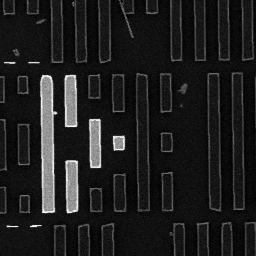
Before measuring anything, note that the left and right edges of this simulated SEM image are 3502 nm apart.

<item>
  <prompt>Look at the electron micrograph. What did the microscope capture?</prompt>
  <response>wiring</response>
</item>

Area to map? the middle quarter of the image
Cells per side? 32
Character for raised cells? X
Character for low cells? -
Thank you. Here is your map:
--------------------------------
--------------------------------
------------------X-----XXX-----
XXX---XXX---XXX---XXX---XXX-----
XXX---XXX---XXX---XXX---XXX-----
XXX---XXX---XXX---XXX---XXX-----
XXX---XXX---XXX---XXX---XXX--X--
XXX---XXX---XXX---XXX---XXX-----
XXX---XXX---XXX---XXX---XXX-----
XXX---------XXX---XXX---XXX-----
XXX---------XXX---XXX---XXX-----
-XX---------XXX---XXX---XXX-----
-XX---------------XXX-----------
-XX---------------XXX-----------
-XX----XX---------XXX-----------
-XX----XX---------XXX-----------
-------XX---------XXX-----------
-------XX---------XXX---XXX-----
-------XX---XXX---XXX---XXX-----
-------XX---XXX---XXX---XXX-----
-------XX----XX---XXX---XXX-----
-------XX---------XXX---XXX-----
-------XX---------XXX-----------
-------XX---------XXX-----------
-XX----XX---------XXX-----------
-XX----XX---------XXX-----------
-XX---------------XXX-----------
-XX---------------XXX---XXX-----
-XX----------XX---XXX---XXX-----
-XX----------XX---XXX---XXX-----
-XX----------XX----XX----XX-----
-XX----XX----XX----XX----XX-----